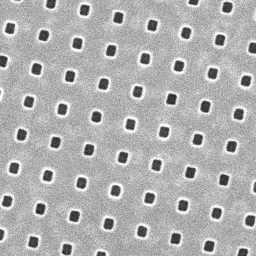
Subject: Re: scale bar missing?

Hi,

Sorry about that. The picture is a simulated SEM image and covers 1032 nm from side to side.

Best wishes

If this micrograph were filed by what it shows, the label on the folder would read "a regular array of holes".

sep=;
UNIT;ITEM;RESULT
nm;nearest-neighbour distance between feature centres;135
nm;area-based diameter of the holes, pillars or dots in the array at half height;47.7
